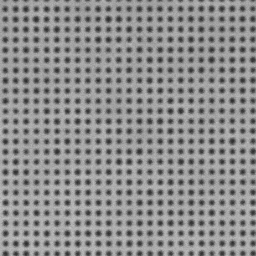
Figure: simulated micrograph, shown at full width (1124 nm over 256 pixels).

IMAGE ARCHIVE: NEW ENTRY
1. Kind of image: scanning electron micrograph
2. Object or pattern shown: a regular array of holes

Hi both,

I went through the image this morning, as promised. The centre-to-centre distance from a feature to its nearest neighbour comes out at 44.3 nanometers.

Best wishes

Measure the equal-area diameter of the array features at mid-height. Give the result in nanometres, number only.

25.3